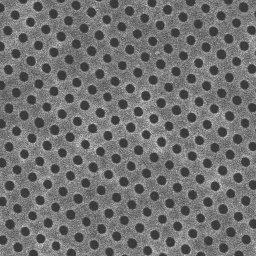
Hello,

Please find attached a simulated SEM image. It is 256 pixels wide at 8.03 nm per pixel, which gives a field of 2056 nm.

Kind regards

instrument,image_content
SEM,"a regular array of holes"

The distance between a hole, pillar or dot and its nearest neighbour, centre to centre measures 135 nm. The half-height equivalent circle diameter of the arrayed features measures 0.0753 um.